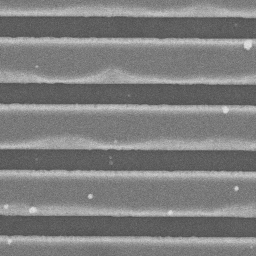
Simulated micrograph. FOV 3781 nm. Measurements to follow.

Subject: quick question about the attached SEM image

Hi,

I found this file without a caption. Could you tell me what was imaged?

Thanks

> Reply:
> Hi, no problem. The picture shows lines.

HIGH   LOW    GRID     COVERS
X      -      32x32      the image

XXXXXXXXXXXXXXXXXXXXXXXXXXXXXXXX
XXXXXXXXXXXXXXXXXXXXXXXXXXXXXXXX
--------------------------------
--------------------------------
--------------------------------
XXXXXXXXXXXXXXXXXXXXXXXXXXXXXXXX
XXXXXXXXXXXXXXXXXXXXXXXXXXXXXXXX
XXXXXXXXXXXXXXXXXXXXXXXXXXXXXXXX
XXXXXXXXXXXXXXXXXXXXXXXXXXXXXXXX
XXXXXXXXXXXXXXXXXXXXXXXXXXXXXXXX
--------------------------------
--------------------------------
--------------------------------
XXXXXXXXXXXXXXXXXXXXXXXXXXXXXXXX
XXXXXXXXXXXXXXXXXXXXXXXXXXXXXXXX
XXXXXXXXXXXXXXXXXXXXXXXXXXXXXXXX
XXXXXXXXXXXXXXXXXXXXXXXXXXXXXXXX
XXXXXXXXXXXXXXXXXXXXXXXXXXXXXXXX
-------------XXXX--------X----XX
--------------------------------
--------------------------------
XX------------------------------
XXXXXXXXXXXXXXXXXXXXXXXXXXXXXXXX
XXXXXXXXXXXXXXXXXXXXXXXXXXXXXXXX
XXXXXXXXXXXXXXXXXXXXXXXXXXXXXXXX
XXXXXXXXXXXXXXXXXXXXXXXXXXXXXXXX
XXXXXXXXXXXXXXXXXXXXXXXXXXXXXXXX
--------------------------------
--------------------------------
--------------------------------
XXXXXXXXXXXXXXXXXXXXXXXXXXXXXXXX
XXXXXXXXXXXXXXXXXXXXXXXXXXXXXXXX